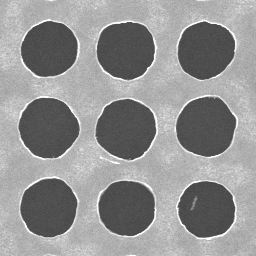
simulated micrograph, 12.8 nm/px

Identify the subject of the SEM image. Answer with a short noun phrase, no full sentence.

a regular array of holes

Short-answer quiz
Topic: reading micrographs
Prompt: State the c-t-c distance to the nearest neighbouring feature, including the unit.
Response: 996 nm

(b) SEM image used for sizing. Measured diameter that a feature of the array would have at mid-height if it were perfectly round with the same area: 746 nanometers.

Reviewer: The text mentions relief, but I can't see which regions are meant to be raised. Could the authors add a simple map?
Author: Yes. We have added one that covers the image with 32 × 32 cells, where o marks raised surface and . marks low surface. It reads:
oooooooooooooooooooooooooooooooo
oooooooooooooooooooooooooooooooo
oooooooooooooooooooooooooooooooo
oooo.....oooo.....ooooo.....oooo
ooo......ooo.......oooo......ooo
ooo.......oo.......ooo.......ooo
ooo.......oo.......ooo.......ooo
ooo......ooo.......ooo.......ooo
ooo......oooo......oooo.....oooo
ooooo..ooooooo....oooooo...ooooo
oooooooooooooooooooooooooooooooo
oooooooooooooooooooooooooooooooo
oooo...oooooooo..ooooooo....oooo
ooo......oooo......oooo......ooo
ooo......oooo......ooo.......ooo
oo........oo.......ooo........oo
oo........oo........oo.......ooo
ooo......ooo.......ooo.......ooo
ooo......oooo......oooo.....oooo
ooooo...oooooo....ooooooo..ooooo
oooooooooooooooooooooooooooooooo
oooooooooooooooooooooooooooooooo
ooooo...oooooooooooooooooooooooo
oooo.....oooo.....ooooo.....oooo
ooo......oooo......oooo......ooo
ooo.......oo.......ooo.......ooo
ooo......ooo.......ooo.......ooo
ooo......oooo......oooo......ooo
ooo......oooo.....ooooo......ooo
ooooo..ooooooooooooooooo...ooooo
oooooooooooooooooooooooooooooooo
oooooooooooooooooooooooooooooooo